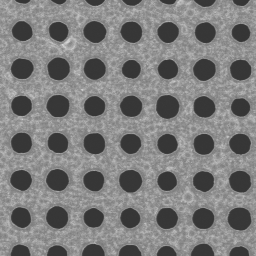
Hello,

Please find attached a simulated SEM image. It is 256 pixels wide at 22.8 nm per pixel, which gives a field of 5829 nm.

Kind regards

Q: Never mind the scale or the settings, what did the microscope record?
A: a regular array of holes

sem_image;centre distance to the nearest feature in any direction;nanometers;825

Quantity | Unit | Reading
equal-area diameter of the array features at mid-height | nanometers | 488